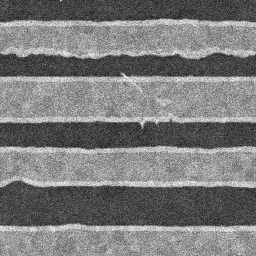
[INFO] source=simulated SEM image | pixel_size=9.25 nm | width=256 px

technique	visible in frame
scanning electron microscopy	one or a few lines or trenches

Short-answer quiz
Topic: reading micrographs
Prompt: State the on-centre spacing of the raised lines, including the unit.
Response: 594 nanometres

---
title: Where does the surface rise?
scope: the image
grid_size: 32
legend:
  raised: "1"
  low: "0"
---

00000000000000000000000000000000
00000000000000000000000000000000
00000000000000000000000000000000
11111111111111111111111111111111
11111111111111111111111111111111
11111111111111111111111111111111
10110001111111111111111111000111
00000000000000000000000000000000
00000000000000000000000000000000
00000000000000000000000000000000
11111111111111111111111111111111
11111111111111111111111111111111
11111111111111111111111111111111
11111111111111111111111111111111
11111111111111111111111111111111
00000000000000000000000000000000
00000000000000000000000000000000
00000000000000000000000000000000
00000000000000000000000000000000
11111111111111111111111111111111
11111111111111111111111111111111
11111111111111111111111111111111
10011111111111111111111111111111
00000000000000000000000000000000
00000000000000000000000000000000
00000000000000000000000000000000
00000000000000000000000000000000
00000000000000000000000000000000
00000001111000000000000000000000
11111111111111111111111111111111
11111111111111111111111111111111
11111111111111111111111111111111